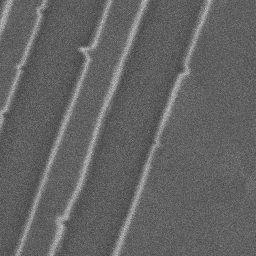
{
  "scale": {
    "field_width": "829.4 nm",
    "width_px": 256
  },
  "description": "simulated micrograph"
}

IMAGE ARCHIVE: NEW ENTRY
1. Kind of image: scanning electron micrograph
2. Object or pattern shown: one or a few lines or trenches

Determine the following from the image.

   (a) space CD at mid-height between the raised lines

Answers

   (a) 194 nanometers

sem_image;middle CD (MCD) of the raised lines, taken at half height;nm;107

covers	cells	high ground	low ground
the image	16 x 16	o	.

ooo....oo....ooo
oo....ooo....ooo
oo....oo....oooo
oo...ooo....oooo
o....oo.....oooo
o....oo....ooooo
.....oo....ooooo
....oo....oooooo
....oo....oooooo
...ooo...ooooooo
...oo....ooooooo
...oo....ooooooo
..ooo....ooooooo
..oo....oooooooo
..oo....oooooooo
.oo....ooooooooo